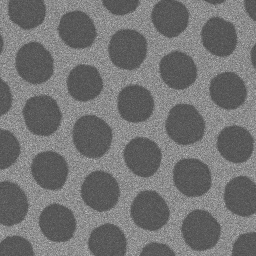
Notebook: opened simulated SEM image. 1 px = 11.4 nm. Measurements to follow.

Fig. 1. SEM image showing a regular array of holes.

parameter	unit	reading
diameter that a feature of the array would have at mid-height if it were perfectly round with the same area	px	38.8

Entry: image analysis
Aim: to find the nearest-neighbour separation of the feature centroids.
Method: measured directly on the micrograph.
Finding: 607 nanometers